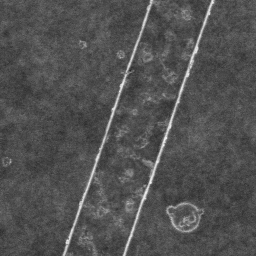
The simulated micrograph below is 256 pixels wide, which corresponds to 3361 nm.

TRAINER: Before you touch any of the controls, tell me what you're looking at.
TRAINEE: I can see one or a few lines or trenches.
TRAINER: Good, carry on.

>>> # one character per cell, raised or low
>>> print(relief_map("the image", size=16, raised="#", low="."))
#########....###
#########....###
#########...####
########....####
########....####
########...#####
#######....#####
#######....#####
#######...######
######....######
######....######
######...#######
#####....#######
#####....#######
#####...########
####....########